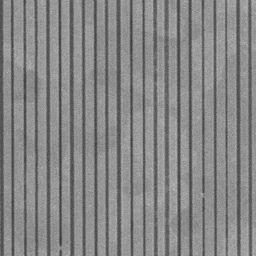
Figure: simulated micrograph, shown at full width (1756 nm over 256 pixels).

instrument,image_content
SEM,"parallel lines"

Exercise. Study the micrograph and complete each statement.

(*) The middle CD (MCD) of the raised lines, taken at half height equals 55.8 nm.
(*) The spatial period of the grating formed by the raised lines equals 81.3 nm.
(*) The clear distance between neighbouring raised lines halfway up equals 24.9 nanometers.